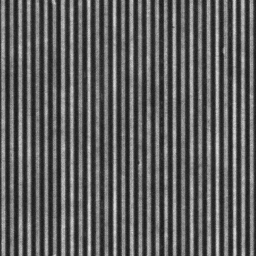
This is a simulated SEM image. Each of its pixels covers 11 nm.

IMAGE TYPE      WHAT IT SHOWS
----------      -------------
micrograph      parallel lines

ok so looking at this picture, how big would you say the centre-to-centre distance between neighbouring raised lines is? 0.0941 microns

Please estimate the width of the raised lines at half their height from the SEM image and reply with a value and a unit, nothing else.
33 nm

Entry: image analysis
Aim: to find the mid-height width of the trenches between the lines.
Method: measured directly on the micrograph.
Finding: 54.9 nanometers